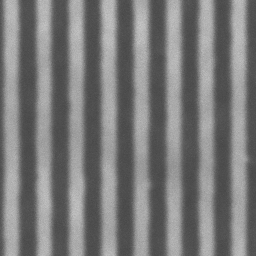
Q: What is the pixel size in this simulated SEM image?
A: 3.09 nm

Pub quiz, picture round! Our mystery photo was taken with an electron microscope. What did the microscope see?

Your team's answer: parallel lines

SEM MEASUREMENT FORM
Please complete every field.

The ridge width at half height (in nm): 39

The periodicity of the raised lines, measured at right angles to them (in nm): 100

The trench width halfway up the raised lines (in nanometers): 59.9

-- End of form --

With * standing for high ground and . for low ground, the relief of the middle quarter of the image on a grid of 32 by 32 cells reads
..***.....***.....***.....***...
..***.....***.....***.....***...
..***.....***.....***.....***...
..***.....***.....***.....***...
..***.....***.....***.....***...
..***.....***.....***.....***...
.****.....***.....***.....***...
.****.....***.....***.....***...
.****.....***.....***.....***...
..***.....***.....***.....***...
..***.....***.....***.....***...
..***.....***.....***.....***...
..***.....***.....***.....***...
..***.....***.....***.....***...
..***.....***.....***.....***...
.****.....***.....***.....***...
.****.....***.....***.....***...
..***.....***.....***.....***...
..***.....***.....***.....***...
.****.....***.....***.....***...
..***.....***.....***.....***...
..***.....***.....***.....***...
..***.....***.....***.....***...
..***.....***.....***.....***...
..***.....***.....***.....***...
.****.....***.....***.....***...
.***......***.....***.....***...
.****.....***.....***.....***...
.****.....***.....***.....***...
..***.....***.....***.....***...
..***.....***.....***.....***...
.****.....***.....***.....***...